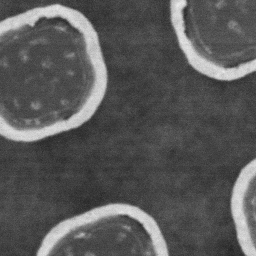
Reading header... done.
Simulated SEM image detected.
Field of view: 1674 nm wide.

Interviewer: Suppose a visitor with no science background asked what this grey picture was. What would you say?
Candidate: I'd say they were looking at raised bodies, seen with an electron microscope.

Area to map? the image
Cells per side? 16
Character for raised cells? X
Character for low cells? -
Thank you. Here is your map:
-----------XXXXX
-XXXX------XXXXX
XXXXXX------XXXX
XXXXXX------XXXX
XXXXXX--------X-
XXXXXX----------
XXXXXX----------
XXXXX-----------
----------------
----------------
----------------
---------------X
---------------X
------XXX------X
----XXXXXX-----X
---XXXXXXX------